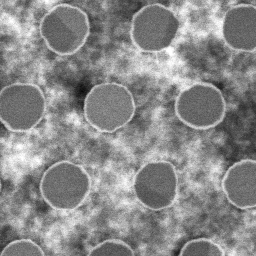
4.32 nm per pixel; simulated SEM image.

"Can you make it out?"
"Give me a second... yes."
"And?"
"raised bodies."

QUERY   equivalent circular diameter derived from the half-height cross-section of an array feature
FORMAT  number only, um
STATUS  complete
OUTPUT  0.209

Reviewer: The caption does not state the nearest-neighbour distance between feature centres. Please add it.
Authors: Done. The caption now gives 0.388 µm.